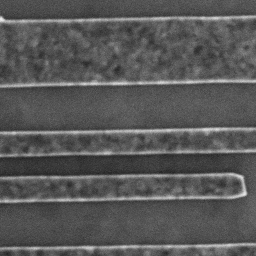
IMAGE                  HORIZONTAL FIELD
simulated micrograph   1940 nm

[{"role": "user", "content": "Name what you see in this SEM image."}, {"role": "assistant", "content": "wiring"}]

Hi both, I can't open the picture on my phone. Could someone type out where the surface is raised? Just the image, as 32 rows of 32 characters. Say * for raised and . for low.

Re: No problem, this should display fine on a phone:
................................
................................
*.......************************
********************************
********************************
********************************
********************************
********************************
********************************
********************************
***********.....................
................................
................................
................................
................................
................................
.*******************************
********************************
********************************
................................
................................
................................
******************************..
*******************************.
******************************..
................................
................................
................................
................................
................................
................................
********************************